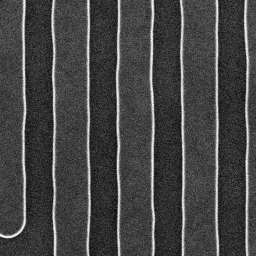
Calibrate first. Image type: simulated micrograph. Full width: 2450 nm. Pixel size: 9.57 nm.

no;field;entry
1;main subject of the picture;groups of lines, slits or small figures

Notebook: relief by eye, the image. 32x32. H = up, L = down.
HHHLLLLHHHHLLLLHHHHLLLLHHHHLLLLH
HHHLLLLHHHHLLLLHHHHLLLLHHHHLLLLH
HHHLLLLHHHHLLLLHHHHLLLLHHHHLLLLH
HHHLLLLHHHHLLLLHHHHLLLLHHHHLLLLH
HHHLLLLHHHHLLLLHHHHLLLLHHHHLLLLH
HHHLLLLHHHHLLLLHHHHLLLLHHHHLLLLH
HHHLLLLHHHHLLLLHHHHLLLLHHHHLLLLH
HHHLLLLHHHHLLLLHHHHLLLLHHHHLLLLH
HHHLLLLHHHHLLLLHHHHLLLLHHHHLLLLH
HHHLLLLHHHHLLLLHHHHLLLLHHHHLLLLH
HHHLLLLHHHHLLLLHHHHLLLLHHHHLLLLH
HHHLLLLHHHHLLLLHHHHLLLLHHHHLLLLH
HHHLLLLHHHHLLLLHHHHLLLLHHHHLLLLH
HHHLLLLHHHHLLLLHHHHLLLLHHHHLLLLH
HHHLLLLHHHHLLLLHHHHLLLLHHHHLLLLH
HHHLLLLHHHHLLLLHHHHLLLLHHHHLLLLH
HHHLLLLHHHHLLLLHHHHLLLLHHHHLLLLH
HHHLLLLHHHHLLLLHHHHLLLLHHHHLLLLH
HHHLLLLHHHHLLLLHHHHLLLLHHHHLLLLH
HHHLLLLHHHHLLLLHHHHLLLLHHHHLLLLH
HHHLLLLHHHHLLLLHHHHLLLLHHHHLLLLH
HHHLLLLHHHHLLLLHHHHLLLLHHHHLLLLH
HHHLLLLHHHHLLLLHHHHLLLLHHHHLLLLH
HHHLLLLHHHHLLLLHHHHLLLLHHHHLLLLH
HHHLLLLHHHHLLLLHHHHLLLLHHHHLLLLH
HHHLLLLHHHHLLLLHHHHLLLLHHHHLLLLH
HHHLLLLHHHHLLLLHHHHLLLLHHHHLLLLH
HHHLLLLHHHHLLLLHHHHLLLLHHHHLLLLH
HHHLLLLHHHHLLLLHHHHLLLLHHHHLLLLH
HHLLLLLHHHHLLLLHHHHLLLLHHHHLLLLH
LLLLLLLHHHHLLLLHHHHLLLLHHHHLLLLH
LLLLLLLHHHHLLLLHHHHLLLLHHHHLLLLH